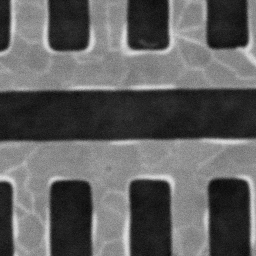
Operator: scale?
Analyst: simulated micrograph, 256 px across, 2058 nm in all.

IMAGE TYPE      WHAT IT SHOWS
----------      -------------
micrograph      groups of lines, slits or small figures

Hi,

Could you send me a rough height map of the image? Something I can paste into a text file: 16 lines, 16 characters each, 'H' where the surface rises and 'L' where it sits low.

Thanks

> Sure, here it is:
LHHLLLHHLLLHHLLL
LHHLLLHHLLLHHLLL
LHHLLLHHLLLHHLLL
HHHHHHHHHHHHHHHH
HHHHHHHHHHHHHHHH
HHHHHHHHHLLHHLLL
LLLLLLLLLLLLLLLL
LLLLLLLLLLLLLLLL
LLLLLLLLLLLLLLLL
HHHHHHHHHHHHHHHH
HHHHHHHHHHHHHHHH
LHHLLLHHLLLHHLLL
LHHLLLHHLLLHHLLL
LHHLLLHHLLLHHLLL
LHHLLLHHLLLHHLLL
LHHLLLHHLLLHHLLL